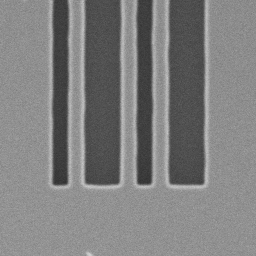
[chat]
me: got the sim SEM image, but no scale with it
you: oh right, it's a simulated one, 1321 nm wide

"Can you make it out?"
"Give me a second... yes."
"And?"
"groups of lines, slits or small figures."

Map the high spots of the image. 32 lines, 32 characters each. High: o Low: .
ooooooo..o.....oo..oo.....oooooo
oooooo...oo....oo..oo.....oooooo
oooooo...oo....oo..oo.....oooooo
ooooooo..o.....oo..oo.....oooooo
ooooooo..o.....oo..oo.....oooooo
ooooooo..o.....oo..oo.....oooooo
oooooo...o.....oo..oo.....oooooo
oooooo...o.....oo..oo.....oooooo
ooooooo..o.....oo..oo.....oooooo
ooooooo..o.....oo..oo.....oooooo
ooooooo..o.....oo..oo.....oooooo
ooooooo..o.....oo..oo.....oooooo
oooooo...oo....oo..oo.....oooooo
oooooo...oo....oo..oo.....oooooo
oooooo...o.....oo..oo.....oooooo
ooooooo..o.....oo..oo.....oooooo
oooooo...o.....oo..oo.....oooooo
oooooo...o.....oo..oo.....oooooo
oooooo...o.....oo..oo.....oooooo
oooooo...o.....oo..oo.....oooooo
oooooo...o.....oo..oo.....oooooo
oooooo...o.....oo..oo.....oooooo
oooooo...o.....oo..oo.....oooooo
oooooooooooooooooooooooooooooooo
oooooooooooooooooooooooooooooooo
oooooooooooooooooooooooooooooooo
oooooooooooooooooooooooooooooooo
oooooooooooooooooooooooooooooooo
oooooooooooooooooooooooooooooooo
oooooooooooooooooooooooooooooooo
oooooooooooooooooooooooooooooooo
oooooooooooooooooooooooooooooooo